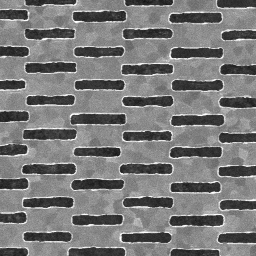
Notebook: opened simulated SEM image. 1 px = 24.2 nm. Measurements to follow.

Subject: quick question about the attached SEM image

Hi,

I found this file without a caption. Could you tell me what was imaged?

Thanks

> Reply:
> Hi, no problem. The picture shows a regular array of holes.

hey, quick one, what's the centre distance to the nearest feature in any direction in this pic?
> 0.803 um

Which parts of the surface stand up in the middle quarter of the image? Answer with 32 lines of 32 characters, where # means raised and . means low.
...############............#####
...###########.............#####
##############............######
################################
###............############.....
###............############.....
###...#..##.#.#############.....
################################
...############............#####
...###########.............#####
###############......#.....#####
################################
##.............#################
##..............###########.....
##..............###########.....
############################.###
...#############################
...############............#####
...############............#####
################################
################################
###...........#############.....
###...........############......
###########################..###
################################
...###########.............#####
...###########.............#####
..#############.#.....##..######
################################
##.............################.
##.............############.....
###..######################.....